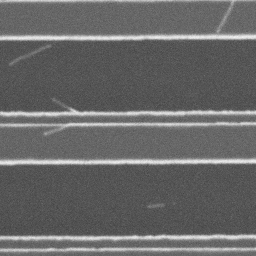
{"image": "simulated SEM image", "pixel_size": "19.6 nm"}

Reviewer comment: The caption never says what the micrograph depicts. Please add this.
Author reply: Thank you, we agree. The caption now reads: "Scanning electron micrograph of lines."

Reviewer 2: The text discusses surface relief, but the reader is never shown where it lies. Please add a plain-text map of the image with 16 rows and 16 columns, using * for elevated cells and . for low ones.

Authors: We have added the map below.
****************
****************
................
................
................
................
................
****************
****************
****************
................
................
................
................
................
****************